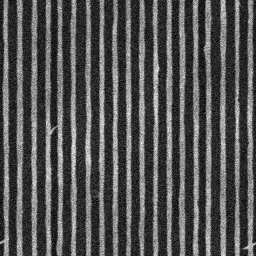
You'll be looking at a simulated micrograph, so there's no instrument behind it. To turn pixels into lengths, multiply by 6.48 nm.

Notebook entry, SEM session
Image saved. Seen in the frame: parallel lines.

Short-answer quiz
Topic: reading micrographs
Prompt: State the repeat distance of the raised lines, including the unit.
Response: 88 nanometers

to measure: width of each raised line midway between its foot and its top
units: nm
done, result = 29.2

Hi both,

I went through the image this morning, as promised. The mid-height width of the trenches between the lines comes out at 0.0583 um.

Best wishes